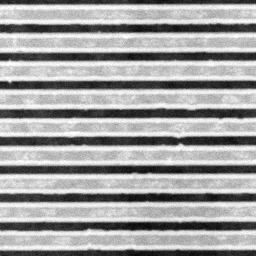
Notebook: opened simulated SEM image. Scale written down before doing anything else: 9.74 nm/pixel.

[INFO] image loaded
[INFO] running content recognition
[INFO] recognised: parallel lines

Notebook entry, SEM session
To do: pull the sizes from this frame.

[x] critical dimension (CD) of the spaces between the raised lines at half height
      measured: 138 nm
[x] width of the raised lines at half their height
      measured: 146 nanometers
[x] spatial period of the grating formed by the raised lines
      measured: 275 nanometres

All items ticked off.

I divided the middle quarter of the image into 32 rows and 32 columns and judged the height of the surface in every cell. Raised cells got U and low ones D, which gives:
UUUUUUUUUUUUUUUUUUUUUUUUUUUUUUUU
UUUUUUUUUUUUUUUUUUUUUUUUUUUUUUUU
UUUUUUUUUUUUUUUUUUUUUUUUUUUUUUUU
UUUUDDDDDDDDDDDDDDDDDDDDDDDDDDDD
DDDDDDDDDDDDDDDDDDDDDDDDDDDDDDDD
DDDDDDDDDDDDDDDDDDDDDDDDDDDDDDDD
DDDDDDDDDDDDDDDDDDDDDDDDDDDDDDDD
UUUUUUUUUUUUUUUUUUUUUUUUUUUUUUUU
UUUUUUUUUUUUUUUUUUUUUUUUUUUUUUUU
UUUUUUUUUUUUUUUUUUUUUUUUUUUUUUUU
UUUUUUUUUUUUUUUUUUUUUUUDDUUUUUUU
DDDDDDDDDDDDDDDDDDDDDDDDDDDDDDDD
DDDDDDDDDDDDDDDDDDDDDDDDDDDDDDDD
DDDDDDDDDDDDDDDDDDDDDDDDDDDDDDDD
UUUUUUUUUUUUUUUUUUUUUUUUUUUUUUUU
UUUUUUUUUUUUUUUUUUUUUUUUUUUUUUUU
UUUUUUUUUUUUUUUUUUUUUUUUUUUUUUUU
UUUUDDUUDDDDDUDDUUDDDDDUDDDUUUUD
DDDDDDDDDDDDDDDDDDDDDDDDDDDDDDDD
DDDDDDDDDDDDDDDDDDDDDDDDDDDDDDDD
DDDDDDDDDDDDDDDDDDDDDDDDDDDDDDDD
UUUUUUUUUUUUUUUUUUUUUUUUUUUUUUUU
UUUUUUUUUUUUUUUUUUUUUUUUUUUUUUUU
UUUUUUUUUUUUUUUUUUUUUUUUUUUUUUUU
UUUUUUDUUDDDDUUDDUUDDUUDDUUUDUDD
DDDDDDDDDDDDDDDDDDDDDDDDDDDDDDDD
DDDDDDDDDDDDDDDDDDDDDDDDDDDDDDDD
DDDDDDDDDDDDDDDDDDDDDDDDDDDDDDDD
UUUUUUUUUUUUUUUUUUUUUUUUUUUUUUUU
UUUUUUUUUUUUUUUUUUUUUUUUUUUUUUUU
UUUUUUUUUUUUUUUUUUUUUUUUUUUUUUUU
UUUUUUUUUUUDDDUUUUUUUUUUUUUUUUUU